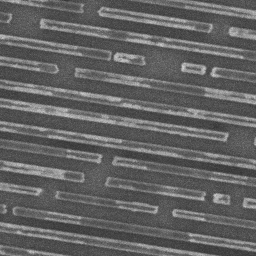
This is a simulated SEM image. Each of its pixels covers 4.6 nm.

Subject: parallel lines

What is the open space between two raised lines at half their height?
0.0603 µm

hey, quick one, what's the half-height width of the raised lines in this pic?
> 38.6 nanometres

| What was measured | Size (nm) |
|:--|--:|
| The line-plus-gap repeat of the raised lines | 95.5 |